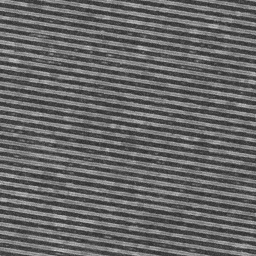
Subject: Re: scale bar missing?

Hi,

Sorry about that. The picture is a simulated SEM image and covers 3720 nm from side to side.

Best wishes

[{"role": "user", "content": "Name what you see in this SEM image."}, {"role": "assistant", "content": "parallel lines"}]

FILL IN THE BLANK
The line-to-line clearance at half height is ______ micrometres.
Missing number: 0.0825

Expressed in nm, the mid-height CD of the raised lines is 35.8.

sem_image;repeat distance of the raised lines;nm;119